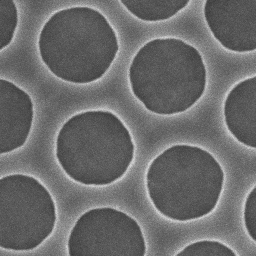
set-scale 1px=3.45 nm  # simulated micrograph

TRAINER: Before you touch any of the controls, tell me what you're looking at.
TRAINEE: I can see holes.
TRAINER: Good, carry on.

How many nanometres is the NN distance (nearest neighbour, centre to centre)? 330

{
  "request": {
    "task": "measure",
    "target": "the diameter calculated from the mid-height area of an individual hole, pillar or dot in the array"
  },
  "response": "264 nm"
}